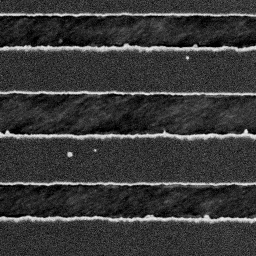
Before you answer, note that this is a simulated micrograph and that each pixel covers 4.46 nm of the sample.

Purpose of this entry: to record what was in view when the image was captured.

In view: lines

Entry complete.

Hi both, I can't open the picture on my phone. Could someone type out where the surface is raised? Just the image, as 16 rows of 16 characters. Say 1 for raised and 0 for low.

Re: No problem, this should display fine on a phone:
1111111111111111
0000000000000000
0000000000000000
1111111111111111
1111111111111111
1111111111111111
0000000000000000
0000000000000000
1111111111111111
1111111111111111
1111111111111111
1111111111111111
0000000000000000
0000000000000000
1111111111111111
1111111111111111